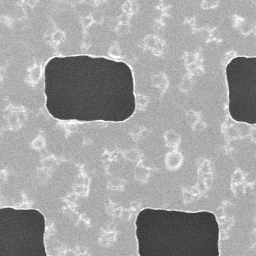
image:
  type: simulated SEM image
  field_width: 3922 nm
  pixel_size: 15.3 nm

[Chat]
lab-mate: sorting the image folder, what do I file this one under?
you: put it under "holes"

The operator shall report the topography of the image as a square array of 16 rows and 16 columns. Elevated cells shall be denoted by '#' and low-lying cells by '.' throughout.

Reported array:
################
################
################
####..##########
###.....######..
###.....######..
###.....######..
#####...#######.
################
################
################
################
################
...######....###
...######.....##
...######.....##